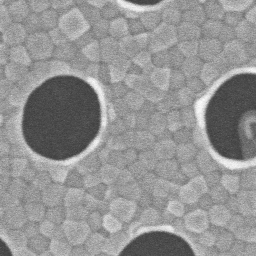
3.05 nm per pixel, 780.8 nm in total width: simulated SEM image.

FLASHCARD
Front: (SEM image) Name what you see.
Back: holes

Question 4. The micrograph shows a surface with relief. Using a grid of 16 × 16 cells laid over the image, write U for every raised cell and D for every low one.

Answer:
UUUUUUUUUUUUUUUU
UUUUUUUUUUUUUUUU
UUUUUUUUUUUUUUUU
UUUUUUUUUUUUUUUU
UUUUUUUUUUUUUUUU
UUDDDDUUUUUUUUDD
UUDDDDUUUUUUUDDD
UDDDDDUUUUUUUDDD
UDDDDDUUUUUUUDDD
UUDDDUUUUUUUUUDD
UUUUUUUUUUUUUUUU
UUUUUUUUUUUUUUUU
UUUUUUUUUUUUUUUU
UUUUUUUUUUUUUUUU
UUUUUUUUUDUUUUUU
DUUUUUUUDDDDUUUU